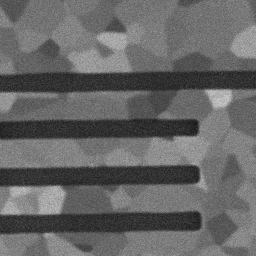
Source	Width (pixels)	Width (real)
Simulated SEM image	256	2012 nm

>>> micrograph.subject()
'groups of lines, slits or small figures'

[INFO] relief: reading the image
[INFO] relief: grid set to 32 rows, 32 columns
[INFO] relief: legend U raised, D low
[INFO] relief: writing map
UUUUUUUUUUUUUUUUUUUUUUUUUUUUUUUU
UUUUUUUUUUUUUUUUUUUUUUUUUUUUUUUU
UUUUUUUUUUUUUUUUUUUUUUUUUUUUUUUU
UUUUUUUUUUUUUUUUUUUUUUUUUUUUUUUU
UUUUUUUUUUUUUUUUUUUUUUUUUUUUUUUU
UUUUUUUUUUUUUUUUUUUUUUUUUUUUUUUU
UUUUUUUUUUUUUUUUUUUUUUUUUUUUUUUU
UUUUUUUUUUUUUUUUUUUUUUUUUUUUUUUU
UUUUUUUUUUUUUUUUUUUUUUUUUUUUUUUU
DDDDDDDDDDDDDDDDDDDDDDDDDDDDDDDD
DDDDDDDDDDDDDDDDDDDDDDDDDDDDDDDD
DDDDDDDDDDDDDDDDDUUDUUUUUUUUUUUU
UUUUUUUUUUUUUUUUUUUUUUUUUUUUUUUU
UUUUUUUUUUUUUUUUUUUUUUUUUUUUUUUU
UUUUUUUUUUUUUUUUUUUUUUUUUUUUUUUU
DDDDDDDDDDDDDDDDDDDDDDDDDUUUUUUU
DDDDDDDDDDDDDDDDDDDDDDDDDUUUUUUU
DUUUUUUUUUUUUUUUUUUUUUUUUUUUUUUU
UUUUUUUUUUUUUUUUUUUUUUUUUUUUUUUU
UUUUUUUUUUUUUUUUUUUUUUUUUUUUUUUU
UUUUUUUUUUUUUUUUUUUUUUUUUUUUUUUU
DDDDDDDDDDDDDDDDDDDDDDDDDUUUUUUU
DDDDDDDDDDDDDDDDDDDDDDDDDUUUUUUU
UUUUUUUUUUUUUUUUUUUUUUUUUUUUUUUU
UUUUUUUUUUUUUUUUUUUUUUUUUUUUUUUU
UUUUUUUUUUUUUUUUUUUUUUUUUUUUUUUU
UUUUUUUUUUUUUUUUUDUUUUDDDUUUUUUU
DDDDDDDDDDDDDDDDDDDDDDDDDUUUUUUU
DDDDDDDDDDDDDDDDDDDDDDDDDUUUUUUU
UUUUUUUUUUUUUUUUUUUUUUUUUUUUUUUU
UUUUUUUUUUUUUUUUUUUUUUUUUUUUUUUU
UUUUUUUUUUUUUUUUUUUUUUUUUUUUUUUU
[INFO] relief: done